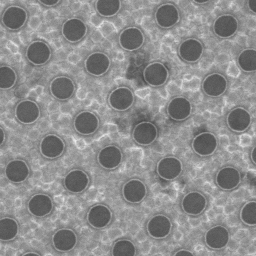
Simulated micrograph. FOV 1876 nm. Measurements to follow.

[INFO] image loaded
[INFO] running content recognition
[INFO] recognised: a regular array of raised bodies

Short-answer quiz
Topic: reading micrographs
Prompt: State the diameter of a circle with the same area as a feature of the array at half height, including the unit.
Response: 176 nm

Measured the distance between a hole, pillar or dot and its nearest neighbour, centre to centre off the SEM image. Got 306 nanometres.